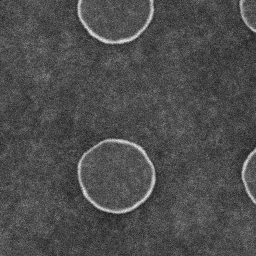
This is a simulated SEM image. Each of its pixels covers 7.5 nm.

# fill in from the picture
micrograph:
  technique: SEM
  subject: raised bodies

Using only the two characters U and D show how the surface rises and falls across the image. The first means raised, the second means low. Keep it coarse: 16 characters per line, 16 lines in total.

DDDDDUUUUUDDDDDU
DDDDDUUUUDDDDDDU
DDDDDDUUDDDDDDDD
DDDDDDDDDDDDDDDD
DDDDDDDDDDDDDDDD
DDDDDDDDDDDDDDDD
DDDDDDDDDDDDDDDD
DDDDDDDDDDDDDDDD
DDDDDDDDDDDDDDDD
DDDDDUUUUDDDDDDD
DDDDDUUUUUDDDDDU
DDDDDUUUUUDDDDDU
DDDDDDUUUDDDDDDD
DDDDDDDDDDDDDDDD
DDDDDDDDDDDDDDDD
DDDDDDDDDDDDDDDD